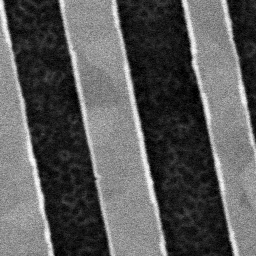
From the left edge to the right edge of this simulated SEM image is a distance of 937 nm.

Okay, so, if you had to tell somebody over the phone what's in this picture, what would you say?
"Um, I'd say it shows one or a few lines or trenches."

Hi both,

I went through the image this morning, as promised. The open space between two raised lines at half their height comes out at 224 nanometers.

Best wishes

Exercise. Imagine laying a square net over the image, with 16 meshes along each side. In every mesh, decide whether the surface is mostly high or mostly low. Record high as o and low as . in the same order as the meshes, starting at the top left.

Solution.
....ooo....ooo..
....ooo.....oo..
o...oooo....ooo.
o...oooo....ooo.
o....ooo....ooo.
o....ooo....ooo.
o....ooo.....ooo
oo...oooo....ooo
oo...oooo....ooo
oo....ooo....ooo
oo....ooo.....oo
oo....oooo....oo
ooo...oooo....oo
ooo...oooo....oo
ooo....ooo....oo
ooo....ooo.....o